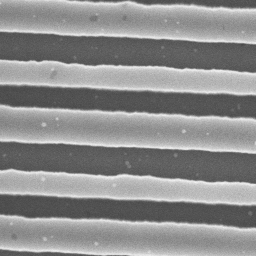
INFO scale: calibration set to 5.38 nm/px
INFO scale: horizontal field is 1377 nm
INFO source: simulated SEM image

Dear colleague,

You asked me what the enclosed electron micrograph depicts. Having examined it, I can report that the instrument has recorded lines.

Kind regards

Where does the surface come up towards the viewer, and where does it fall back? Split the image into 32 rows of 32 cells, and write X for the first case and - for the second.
XXXXXXXXXXXXXXXXX---------------
XXXXXXXXXXXXXXXXXXXXXXXXXXXXXXXX
XXXXXXXXXXXXXXXXXXXXXXXXXXXXXXXX
XXXXXXXXXXXXXXXXXXXXXXXXXXXXXXXX
--------------XXXXXXXXXXXXXXXXXX
--------------------------------
--------------------------------
--------------------------------
XXXXXXXXXXXXXXXXXXXXX-----------
XXXXXXXXXXXXXXXXXXXXXXXXXXXXXXXX
-XXXXXXXXXXXXXXXXXXXXXXXXXXXXXXX
-------------------------XX-XXXX
--------------------------------
XX------------------------------
XXXXXXXXXXXXXXXXXXXXXXX---------
XXXXXXXXXXXXXXXXXXXXXXXXXXXXXXXX
XXXXXXXXXXXXXXXXXXXXXXXXXXXXXXXX
XXXXXXXXXXXXXXXXXXXXXXXXXXXXXXXX
--------------------XXXXXXXXXXXX
--------------------------------
--------------------------------
XXX-----------------------------
XXXXXXXXXXXXXXXXXXXXXXX---------
XXXXXXXXXXXXXXXXXXXXXXXXXXXXXXXX
--------XXXXXXXXXXXXXXXXXXXXXXXX
-----------------------------XXX
--------------------------------
XXXXXXXXX-X-X-------------------
XXXXXXXXXXXXXXXXXXXXXXXXXXXXXX--
XXXXXXXXXXXXXXXXXXXXXXXXXXXXXXXX
XXXXXXXXXXXXXXXXXXXXXXXXXXXXXXXX
--------XXXXXXXXXXXXXXXXXXXXXXXX